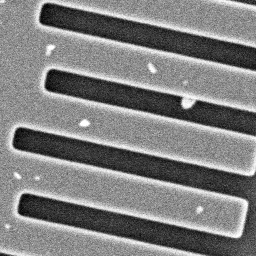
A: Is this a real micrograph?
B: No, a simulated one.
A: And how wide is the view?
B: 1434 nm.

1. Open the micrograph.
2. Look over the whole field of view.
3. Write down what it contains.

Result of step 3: groups of lines, slits or small figures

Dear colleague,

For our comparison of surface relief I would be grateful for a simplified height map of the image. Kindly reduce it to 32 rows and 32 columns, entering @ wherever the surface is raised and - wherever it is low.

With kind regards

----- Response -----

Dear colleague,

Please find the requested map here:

@@@@@--@@@@@@@@@@@@@@@@@@@@@@@--
@@@@@-------@@@@@@@@@@@@@@@@@@@@
@@@@@------------@@@@@@@@@@@@@@@
@@@@@@---------------@@@@@@@@@@@
@@@@@@@@@@@--------------@@@@@@@
@@@@@@@@@@@@@@@@--------------@@
@@@@@@@@@@@@@@@@@@@@@-----------
@@@@@@@@@@@@@@@@@@@@@@@@@-------
@@@@@@@@@@@@@@@@@@@@@@@@@@@@@@--
@@@@@@-----@@@@@@@@@@@@@@@@@@@@@
@@@@@-----------@@@@@@@@@@@@@@@@
@@@@@@--------------@@@@@@@@@@@@
@@@@@@@@@@@------------@-@@@@@@@
@@@@@@@@@@@@@@@---------------@@
@@@@@@@@@@@@@@@@@@@@------------
@@@@@@@@@@@@@@@@@@@@@@@@--------
@@----@@@@@@@@@@@@@@@@@@@@@@@---
@@---------@@@@@@@@@@@@@@@@@@@@@
@@-------------@@@@@@@@@@@@@@@@@
@@@@@---------------@@@@@@@@@@@@
@@@@@@@@@@--------------@@@@@@@@
@@@@@@@@@@@@@@@--------------@@@
@@@@@@@@@@@@@@@@@@@-------------
@@@@@@@@@@@@@@@@@@@@@@@@--------
@@@--@@@@@@@@@@@@@@@@@@@@@@@@---
@@--------@@@@@@@@@@@@@@@@@@@@@-
@@------------@@@@@@@@@@@@@@@@@-
@@@@@--------------@@@@@@@@@@@@-
@@@@@@@@@@--------------@@@@@@--
@@@@@@@@@@@@@@---------------@--
@@@@@@@@@@@@@@@@@@--------------
@@@@@@@@@@@@@@@@@@@@@@@---------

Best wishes